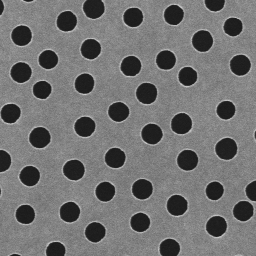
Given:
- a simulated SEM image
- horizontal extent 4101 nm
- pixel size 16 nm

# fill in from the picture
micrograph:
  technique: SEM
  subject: a regular array of holes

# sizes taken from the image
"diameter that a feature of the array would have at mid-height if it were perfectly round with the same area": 331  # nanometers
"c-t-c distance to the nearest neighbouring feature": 563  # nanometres